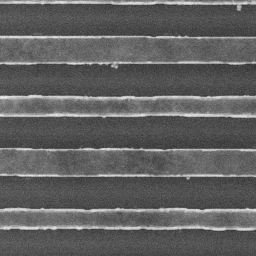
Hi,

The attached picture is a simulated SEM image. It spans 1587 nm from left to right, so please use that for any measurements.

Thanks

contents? lines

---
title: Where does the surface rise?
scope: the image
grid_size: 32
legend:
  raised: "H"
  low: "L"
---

LLLLLLLLLLLLLLLLLLLLLLLLLLLLLLLL
LLLLLLLLLLLLLLLLLLLLLLLLLLLLLLLL
LLLLLLLLLLLLLLLLLLLLLLLLLLLLLLLL
LLLLLLLLLLLLLLLLLLLLLLLLLLLLLLLL
LLLLLLLLLLLLLLLLLLLLLLLLLLLLLLLL
HHHHHHHHHHHHHHHHHHHHHHHHHHHHHHHH
HHHHHHHHHHHHHHHHHHHHHHHHHHHHHHHH
HHHHHHHHHHHHHHHHHHHHHHHHHHHHHHHH
LLLLLLLLLLLLLLLLLLLLLLLLLLLLLLLL
LLLLLLLLLLLLLLLLLLLLLLLLLLLLLLLL
LLLLLLLLLLLLLLLLLLLLLLLLLLLLLLLL
LLLLLLLLLLLLLLLLLLLLLLLLLLLLLLLL
HHHHHHHHHHHHHHHHHHHHHHHHHHHHHHHH
HHHHHHHHHHHHHHHHHHHHHHHHHHHHHHHH
LLLLLLLLLLLLLLLLLLLLLLLLLLLLLHHH
LLLLLLLLLLLLLLLLLLLLLLLLLLLLLLLL
LLLLLLLLLLLLLLLLLLLLLLLLLLLLLLLL
LLLLLLLLLLLLLLLLLLLLLLLLLLLLLLLL
LLLLLLLLLLLLLLLLLLLLLLLLLLLLLLLL
HHHHHHHHHHHHHHHHHHHHHHHHHHHHHHHH
HHHHHHHHHHHHHHHHHHHHHHHHHHHHHHHH
HHHHHHHHHHHHHHHHHHHHHHHHHHHHHHHH
LLLLLLLLLLLLLLLLLLLLLLLLLLLLLLLL
LLLLLLLLLLLLLLLLLLLLLLLLLLLLLLLL
LLLLLLLLLLLLLLLLLLLLLLLLLLLLLLLL
LLLLLLLLLLLLLLLLLLLLLLLLLLLLLLLL
HHHHHHHHHHHHHHHHHHHHHHHHHHHHHHHH
HHHHHHHHHHHHHHHHHHHHHHHHHHHHHHHH
HHHHHHHHHHHHHHHHHHHHHHHHHHHHHHHH
LLLLLLLLLLLLLLLLLLLLLLLLLLLLLLLL
LLLLLLLLLLLLLLLLLLLLLLLLLLLLLLLL
LLLLLLLLLLLLLLLLLLLLLLLLLLLLLLLL